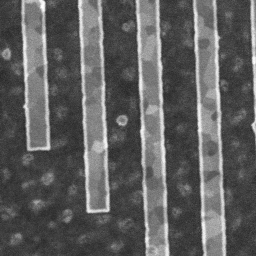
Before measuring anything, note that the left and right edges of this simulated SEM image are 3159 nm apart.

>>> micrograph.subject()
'parallel lines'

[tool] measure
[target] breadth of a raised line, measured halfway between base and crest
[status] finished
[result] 0.243 um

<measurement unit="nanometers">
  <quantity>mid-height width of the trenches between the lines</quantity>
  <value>464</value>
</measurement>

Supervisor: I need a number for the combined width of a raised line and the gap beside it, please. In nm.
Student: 707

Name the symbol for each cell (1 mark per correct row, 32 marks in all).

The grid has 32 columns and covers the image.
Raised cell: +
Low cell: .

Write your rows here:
...++.....++.....+++....+++.....
...++.....+++....+++....+++.....
...++.....+++....+++.....++.....
...++.....+++....+++.....++.....
...++.....+++....+++.....++.....
...+++....+++....+++.....++.....
...+++....+++....+++.....++.....
...+++....+++.....++.....++.....
...+++....+++.....++.....++.....
...+++....+++.....++.....++.....
...+++....+++.....++.....++.....
...+++.....++.....++.....++.....
...+++....+++.....++.....++.....
...+++.....++.....++.....++.....
...+++.....++.....++.....++.....
....++.....++.....++.....++.....
....++.....++.....++.....++.....
....++.....++.....++.....++.....
....++.....++.....++.....+++....
...........++.....++.....+++....
...........++.....++.....+++....
...........++.....++.....+++....
...........++.....+++....+++....
...........++.....+++....+++....
...........++.....+++....+++....
...........++.....+++....+++....
..................+++....+++....
..................+++....+++....
..................+++....+++....
..................+++....+++....
..................+++.....++....
..................+++.....++....